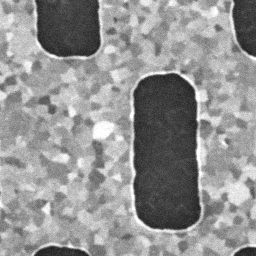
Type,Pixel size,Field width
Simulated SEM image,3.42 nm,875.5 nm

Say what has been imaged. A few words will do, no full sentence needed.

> holes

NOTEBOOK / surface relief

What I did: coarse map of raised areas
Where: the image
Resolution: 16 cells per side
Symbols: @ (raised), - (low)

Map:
@@----@@@@@@@@@-
@@----@@@@@@@@@-
@@----@@@@@@@@@-
@@@---@@@@@@@@@@
@@@@@@@@@@@@@@@@
@@@@@@@@----@@@@
@@@@@@@@----@@@@
@@@@@@@@----@@@@
@@@@@@@@----@@@@
@@@@@@@@----@@@@
@@@@@@@@----@@@@
@@@@@@@@----@@@@
@@@@@@@@-----@@@
@@@@@@@@@----@@@
@@@@@@@@@@@@@@@@
@@@--@@@@@@@@@@-